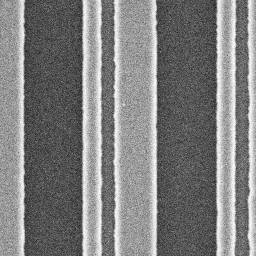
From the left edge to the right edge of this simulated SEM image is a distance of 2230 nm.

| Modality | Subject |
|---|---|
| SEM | lines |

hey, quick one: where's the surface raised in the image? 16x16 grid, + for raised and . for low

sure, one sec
+....+++++....++
+....+++++....++
+....+++++....++
+....+++++....++
+....+++++....++
+....+++++....++
+....+++++....++
+....+++++....++
+....+++++....++
+....+++++....++
+....+++++....++
+....+++++....++
+....+++++....++
+....+++++....++
+....+++++....++
+....+++++....++